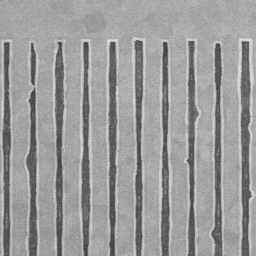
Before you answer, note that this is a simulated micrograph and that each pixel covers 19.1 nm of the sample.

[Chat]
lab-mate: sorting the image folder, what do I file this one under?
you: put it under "parallel lines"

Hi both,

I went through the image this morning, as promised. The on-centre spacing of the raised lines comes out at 0.506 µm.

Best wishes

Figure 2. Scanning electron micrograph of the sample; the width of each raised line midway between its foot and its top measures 0.349 microns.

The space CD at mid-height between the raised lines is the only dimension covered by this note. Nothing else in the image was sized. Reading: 0.165 µm